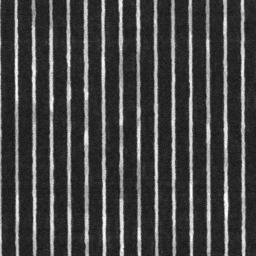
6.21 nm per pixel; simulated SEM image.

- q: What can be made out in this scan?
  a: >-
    parallel lines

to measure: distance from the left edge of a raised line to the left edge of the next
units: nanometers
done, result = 108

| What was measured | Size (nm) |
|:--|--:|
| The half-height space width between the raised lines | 90.8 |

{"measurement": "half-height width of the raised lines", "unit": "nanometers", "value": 17.9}